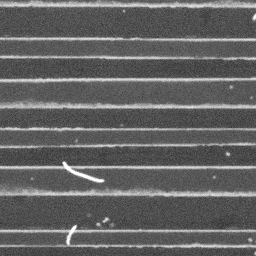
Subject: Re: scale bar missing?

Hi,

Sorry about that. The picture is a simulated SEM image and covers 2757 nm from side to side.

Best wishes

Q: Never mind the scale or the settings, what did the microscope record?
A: lines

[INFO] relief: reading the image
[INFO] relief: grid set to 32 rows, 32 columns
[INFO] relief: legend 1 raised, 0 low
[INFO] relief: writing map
11111111111111111111111111111111
00000000000000000000000000000000
00000000000000000000000000000000
00000000000000000000000000000000
00000000000000000000000000000000
11111111111111111111111111111111
11111111111111111111111111111111
00000000000000000000000000000000
00000000000000000000000000000000
00000000000000000000000000000000
11111111111111111111111111111111
11111111111111111111111111111111
11111111111111111111111111111111
00000000000000000000000000000000
00000000000000000000000000000000
00000000000000000000000000000000
11111111111111111111111111111111
11111111111111111111111111111111
00000000000000000000000000000000
00000000000000000000000000000000
00000000000000000000000000000000
11111111111111111111111111111111
11111111111111111111111111111111
11111111111111111111111111111111
00000000000000000000000000000000
00000000000000000000000000000000
00000000000000000000000000000000
00000000000000000000000000000000
00000000000000000000000000000000
11111111111111111111111111111111
11111111111111111111111111111111
00000000000000000000000000000000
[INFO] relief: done